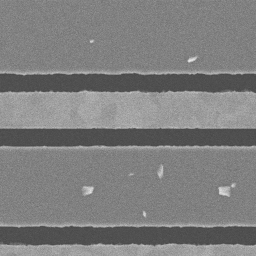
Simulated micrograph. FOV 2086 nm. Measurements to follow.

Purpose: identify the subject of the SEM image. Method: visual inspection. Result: lines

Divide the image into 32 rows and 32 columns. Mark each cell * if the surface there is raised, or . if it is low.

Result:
********************************
********************************
********************************
********************************
********************************
********************************
********************************
********************************
********************************
................................
................................
..........*............**.......
********************************
********************************
********************************
********************************
................................
................................
********************************
********************************
********************************
********************************
********************************
********************************
********************************
********************************
********************************
********************************
................................
................................
................................
********************************